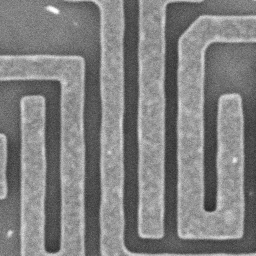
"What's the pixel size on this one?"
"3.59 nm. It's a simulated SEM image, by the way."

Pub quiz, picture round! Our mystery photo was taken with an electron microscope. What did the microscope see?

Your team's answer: wiring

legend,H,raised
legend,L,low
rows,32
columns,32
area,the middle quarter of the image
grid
HHHHHLLLLHHHHHHLLLLHHHHHHLLLLHHH
HHHHHLLLLHHHHHHLLLLHHHHHHLLLLHHH
HHHHHLLLLHHHHHHLLLLHHHHHHLLLLHHH
HHHHHLLLLHHHHHHLLLLHHHHHHLLLLHHH
HHHHHLLLLHHHHHHLLLLHHHHHHLLLLHHH
HHHHHLLLLHHHHHHLLLLHHHHHHLLLLHHH
HHHHHLLLLHHHHHHLLLLHHHHHHLLLLHHH
HHHHHLLLLHHHHHHLLLLHHHHHHLLLLHHH
HHHHHLLLLHHHHHHLLLLHHHHHHLLLLHHH
HHHHHLLLLLHHHHHLLLLHHHHHHLLLLHHH
HHHHHLLLLLHHHHHLLLLHHHHHHLLLLHHH
HHHHHLLLLLHHHHHLLLLHHHHHHLLLLHHH
HHHHHLLLLLHHHHHLLLLHHHHHHLLLLHHH
HHHHHLLLLLHHHHHLLLLHHHHHHLLLLHHH
HHHHHLLLLLHHHHHLLLLHHHHHHLLLLHHH
HHHHHLLLLHHHHHHLLLLHHHHHHLLLLHHH
HHHHHLLLLHHHHHHLLLLHHHHHHLLLLHHH
HHHHHLLLLHHHHHHLLLLHHHHHHLLLLHHH
HHHHHLLLLHHHHHHLLLLHHHHHHLLLLHHH
HHHHHLLLLHHHHHHLLLLHHHHHHLLLLHHH
HHHHHLLLLHHHHHHLLLLHHHHHHLLLLHHH
HHHHHLLLLHHHHHHLLLLHHHHHHLLLLHHH
HHHHHLLLLHHHHHHLLLLHHHHHHLLLLHHH
HHHHHLLLLHHHHHHLLLLHHHHHHLLLLHHH
HHHHHLLLLHHHHHHLLLLHHHHHHLLLLHHH
HHHHHLLLLHHHHHHLLLLHHHHHHLLLLHHH
HHHHHLLLLHHHHHHLLLLHHHHHHLLLLHHH
HHHHHLLLLHHHHHHLLLLHHHHHHLLLLHHH
HHHHHLLLLHHHHHHLLLLHHHHHHLLLLHHH
HHHHHLLLLHHHHHHLLLLHHHHHHLLLLHHH
HHHHHLLLLHHHHHHLLLLHHHHHHLLLLHHH
HHHHHLLLLHHHHHHLLLLHHHHHHLLLLHHH